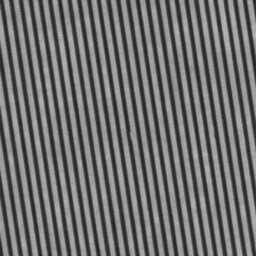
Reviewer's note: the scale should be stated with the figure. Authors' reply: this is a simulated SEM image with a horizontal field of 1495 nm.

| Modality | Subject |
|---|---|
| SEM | parallel lines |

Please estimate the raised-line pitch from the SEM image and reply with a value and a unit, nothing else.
56.3 nm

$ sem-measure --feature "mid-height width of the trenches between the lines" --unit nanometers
25.9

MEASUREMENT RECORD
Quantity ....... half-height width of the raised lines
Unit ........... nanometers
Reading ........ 31.1